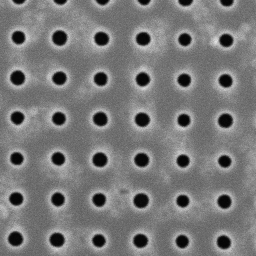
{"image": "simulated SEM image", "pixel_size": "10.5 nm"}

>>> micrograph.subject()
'a regular array of holes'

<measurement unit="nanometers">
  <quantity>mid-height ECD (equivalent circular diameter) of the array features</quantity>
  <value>151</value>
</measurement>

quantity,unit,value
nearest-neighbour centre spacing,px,40.2